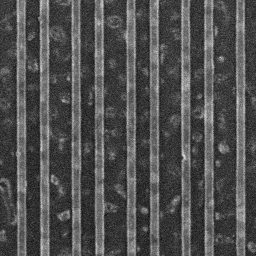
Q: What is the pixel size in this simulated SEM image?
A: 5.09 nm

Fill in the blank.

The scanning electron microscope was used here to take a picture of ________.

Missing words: parallel lines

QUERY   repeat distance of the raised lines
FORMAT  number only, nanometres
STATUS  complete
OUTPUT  139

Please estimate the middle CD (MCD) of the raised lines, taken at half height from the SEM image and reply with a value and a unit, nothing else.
7.13 px